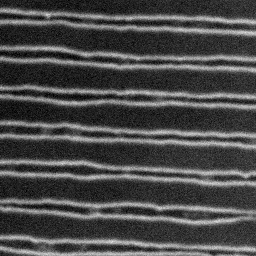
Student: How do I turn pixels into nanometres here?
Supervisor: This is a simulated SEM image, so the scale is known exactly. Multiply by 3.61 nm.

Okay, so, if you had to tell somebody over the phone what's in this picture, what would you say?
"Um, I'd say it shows parallel lines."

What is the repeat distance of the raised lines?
136 nanometres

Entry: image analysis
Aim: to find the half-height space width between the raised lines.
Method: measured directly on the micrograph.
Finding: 27.5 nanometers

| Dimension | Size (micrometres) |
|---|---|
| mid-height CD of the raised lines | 0.109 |